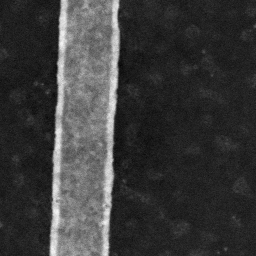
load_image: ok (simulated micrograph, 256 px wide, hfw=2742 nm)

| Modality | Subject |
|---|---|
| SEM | one or a few lines or trenches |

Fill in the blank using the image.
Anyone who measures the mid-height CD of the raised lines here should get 555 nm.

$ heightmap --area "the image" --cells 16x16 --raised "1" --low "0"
0000111000000000
0000111000000000
0000111000000000
0000111000000000
0000111000000000
0000111000000000
0000111000000000
0000111000000000
0000111000000000
0000111000000000
0000111000000000
0001111000000000
0001111000000000
0001111000000000
0001111000000000
0001111000000000